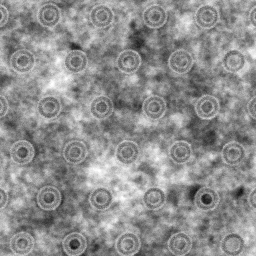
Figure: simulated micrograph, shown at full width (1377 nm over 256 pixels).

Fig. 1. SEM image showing a regular array of ring-shaped raised bodies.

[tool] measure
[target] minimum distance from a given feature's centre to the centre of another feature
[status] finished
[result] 280 nanometres